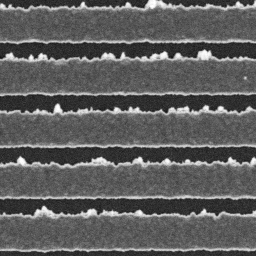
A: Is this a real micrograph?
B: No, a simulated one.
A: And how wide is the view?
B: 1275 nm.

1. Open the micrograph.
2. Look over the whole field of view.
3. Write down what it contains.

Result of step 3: lines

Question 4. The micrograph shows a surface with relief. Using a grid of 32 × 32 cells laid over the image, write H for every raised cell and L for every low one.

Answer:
LLLLLLLLLLLLLLLLLLHHHLLLLLLLLLLL
HHHHHHHHHHHHHHHHHHHHHHHHHHHHHHHH
HHHHHHHHHHHHHHHHHHHHHHHHHHHHHHHH
HHHHHHHHHHHHHHHHHHHHHHHHHHHHHHHH
HHHHHHHHHHHHHHHHHHHHHHHHHHHHHHHH
LLLLLLLLLLLLLLLLLLLLLLLLLLLLLLLL
LLLLLLLLLLLLLLLLLLLLLLLLLHLLLLLL
HHHHHHHHHHHHHHHHHHHHHHHHHHHHHHHH
HHHHHHHHHHHHHHHHHHHHHHHHHHHHHHHH
HHHHHHHHHHHHHHHHHHHHHHHHHHHHHHHH
HHHHHHHHHHHHHHHHHHHHHHHHHHHHHHHH
HHHHHHHHHHHHHHHHHHHHHHHHHHHHHHHH
LLLLLLLLLLLLLLLLLLLLLLLLLLLLLLLL
LLLLLLLHLLLLLLLLLLLLLLLLLHLLLLLL
HHHHHHHHHHHHHHHHHHHHHHHHHHHHHHHH
HHHHHHHHHHHHHHHHHHHHHHHHHHHHHHHH
HHHHHHHHHHHHHHHHHHHHHHHHHHHHHHHH
HHHHHHHHHHHHHHHHHHHHHHHHHHHHHHHH
LLLLLLLLLLLLLLLLLLLLLLLLLLLLLLLL
LLLLLLLLLLLLLLLLLLLLLLLLLLLLLLLL
LHHLHLHLLLHHHHLHHHHHHHHHHHHHHHHH
HHHHHHHHHHHHHHHHHHHHHHHHHHHHHHHH
HHHHHHHHHHHHHHHHHHHHHHHHHHHHHHHH
HHHHHHHHHHHHHHHHHHHHHHHHHHHHHHHH
HHHHHHHHHHHHHHHHHHHHHHHHHHHHHHHH
LLLLLLLLLLLLLLLLLLLLLLLLLLLLLLLL
LLLLLHLLLLLHLLLLLLLLLLLLLLLLLLLL
HHHHHHHHHHHHHHHHHHHHHHHHHHHHHHHH
HHHHHHHHHHHHHHHHHHHHHHHHHHHHHHHH
HHHHHHHHHHHHHHHHHHHHHHHHHHHHHHHH
HHHHHHHHHHHHHHHHHHHHHHHHHHHHHHHH
LLLLLHLLLLLLLLLLLLLLLLLLLLLLLLLL